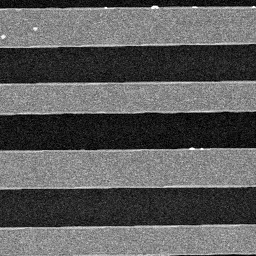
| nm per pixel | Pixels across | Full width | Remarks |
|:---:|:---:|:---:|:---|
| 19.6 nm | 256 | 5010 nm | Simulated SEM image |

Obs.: lines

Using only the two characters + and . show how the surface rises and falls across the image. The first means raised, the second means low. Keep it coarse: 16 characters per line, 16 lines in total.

.........+..+.++
++++++++++++++++
++++++++++++++++
................
................
++++++++++++++++
++++++++++++++++
................
................
++++++++++++++++
++++++++++++++++
++++++++++++++++
................
................
++++++++++++++++
++++++++++++++++